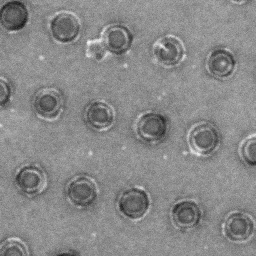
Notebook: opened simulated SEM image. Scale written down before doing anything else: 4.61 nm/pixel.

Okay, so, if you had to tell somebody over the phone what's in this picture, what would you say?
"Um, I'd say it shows a regular array of ring-shaped raised bodies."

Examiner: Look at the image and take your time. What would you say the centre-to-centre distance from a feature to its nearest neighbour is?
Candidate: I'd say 52.7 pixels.